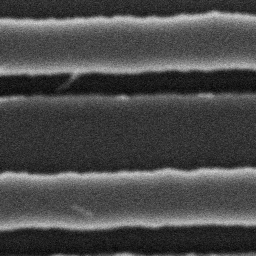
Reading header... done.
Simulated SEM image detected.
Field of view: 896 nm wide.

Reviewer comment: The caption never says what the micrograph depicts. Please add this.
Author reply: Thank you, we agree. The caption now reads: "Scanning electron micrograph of lines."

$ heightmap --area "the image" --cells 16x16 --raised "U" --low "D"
DDDDDDDDDDDDDDDD
UUUUUUUUUUUUUUUU
UUUUUUUUUUUUUUUU
UUUUUUUUUUUUUUUU
UUUUDDDUDDDDDDDD
DDDDDDDDDDDDDDDD
DDDDDDDDDDDDDDDD
DDDDDDDDDDDDDDDD
DDDDDDDDDDDDDDDD
DDDDDDDDDDDDDDDD
DDDDDDDDDDDDDDDU
UUUUUUUUUUUUUUUU
UUUUUUUUUUUUUUUU
UUUUUUUUUUUUUUUU
DDDDDDDDDDDDDDDD
DDDDDDDDDDDDDDDD